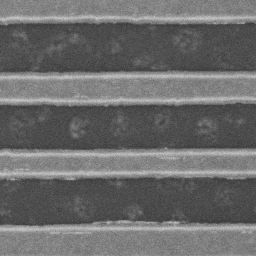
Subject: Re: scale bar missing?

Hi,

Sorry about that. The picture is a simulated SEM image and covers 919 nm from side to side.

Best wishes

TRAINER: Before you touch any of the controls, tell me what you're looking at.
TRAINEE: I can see one or a few lines or trenches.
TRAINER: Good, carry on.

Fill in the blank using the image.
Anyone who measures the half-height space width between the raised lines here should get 0.199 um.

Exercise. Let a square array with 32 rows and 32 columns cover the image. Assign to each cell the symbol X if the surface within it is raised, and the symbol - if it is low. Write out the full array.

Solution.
XXXXXXXXXXXXXXXXXXXXXXXXXXXXXXXX
XXXXXXXXXXXXXXXXXXXXXXXXXXXXXXXX
--------------------------------
--------------------------------
--------------------------------
--------------------------------
--------------------------------
--------------------------------
--------------------------------
---------------X----------------
XXXXXXXXXXXXXXXXXXXXXXXXXXXXXXXX
XXXXXXXXXXXXXXXXXXXXXXXXXXXXXXXX
------XXXXXXXXXXXX----X---------
--------------------------------
--------------------------------
--------------------------------
--------------------------------
--------------------------------
--------------------------------
XXXXXXXXXXXXXXXXXXXXXXXXXXXXXXXX
XXXXXXXXXXXXXXXXXXXXXXXXXXXXXXXX
XXXXXXXXXXXXXXXXXXX-XXXXXX-XXXXX
--------------------------------
--------------------------------
--------------------------------
--------------------------------
--------------------------------
--------------------------------
------------------------------XX
XXXXXXXXXXXXXXXXXXXXXXXXXXXXXXXX
XXXXXXXXXXXXXXXXXXXXXXXXXXXXXXXX
XXXXXXXXXXXXXXXXXXXXXXXXXXXXXXXX